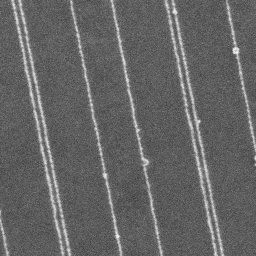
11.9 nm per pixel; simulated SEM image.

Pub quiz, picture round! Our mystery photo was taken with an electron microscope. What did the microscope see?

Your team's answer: lines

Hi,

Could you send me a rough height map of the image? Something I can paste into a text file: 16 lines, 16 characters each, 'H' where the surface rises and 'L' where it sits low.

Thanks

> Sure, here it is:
LLLLHHHLLLLLLLHH
LLLLLHHLLLLLLLHH
LLLLLHHLLLLLLLLH
LLLLLHHHLLLLLLLH
LLLLLHHHLLLLLLLH
LLLLLLHHLLLLLLLH
LLLLLLHHLLLLLLLH
LLLLLLHHLLLLLLLL
LLLLLLHHHLLLLLLL
LLLLLLHHHLLLLLLL
LLLLLLHHHLLLLLLL
LLLLLLLHHLLLLLLL
LLLLLLLHHLLLLLLL
LLLLLLLHHHLLLLLL
LLLLLLLHHHLLLLLL
LLLLLLLHHHLLLLLL